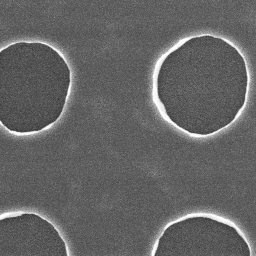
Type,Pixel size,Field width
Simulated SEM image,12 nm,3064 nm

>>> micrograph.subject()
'holes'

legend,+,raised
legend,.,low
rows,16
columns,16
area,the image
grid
++++++++++++++++
++++++++++++++++
++++++++++++..++
....++++++.....+
....++++++.....+
....++++++.....+
....++++++.....+
...++++++++....+
++++++++++++++++
++++++++++++++++
++++++++++++++++
++++++++++++++++
++++++++++++++++
..++++++++++++++
....++++++.....+
....++++++......